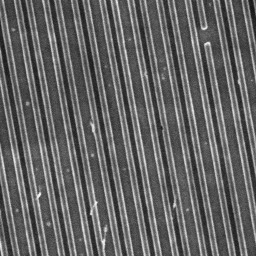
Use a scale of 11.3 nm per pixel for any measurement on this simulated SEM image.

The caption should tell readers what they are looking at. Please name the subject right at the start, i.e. parallel lines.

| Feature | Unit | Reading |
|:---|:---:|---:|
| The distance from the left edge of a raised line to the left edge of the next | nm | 159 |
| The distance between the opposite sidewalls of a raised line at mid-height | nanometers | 62.7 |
